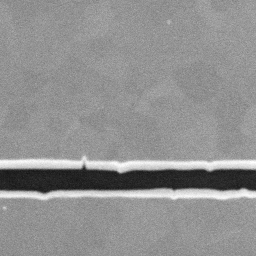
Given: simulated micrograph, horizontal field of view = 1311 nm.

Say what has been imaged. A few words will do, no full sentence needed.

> one or a few lines or trenches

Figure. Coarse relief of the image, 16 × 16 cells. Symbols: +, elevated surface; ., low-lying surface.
++++++++++++++++
++++++++++++++++
++++++++++++++++
++++++++++++++++
++++++++++++++++
++++++++++++++++
++++++++++++++++
++++++++++++++++
++++++++++++++++
++++++++++++++++
................
................
++++++++++++++++
++++++++++++++++
++++++++++++++++
++++++++++++++++